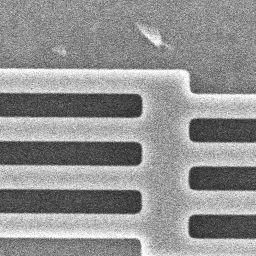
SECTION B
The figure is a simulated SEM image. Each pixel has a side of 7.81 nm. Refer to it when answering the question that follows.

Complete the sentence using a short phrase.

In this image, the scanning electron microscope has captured groups of lines, slits or small figures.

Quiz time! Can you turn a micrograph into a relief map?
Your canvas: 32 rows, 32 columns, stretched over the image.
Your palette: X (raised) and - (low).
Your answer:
--------------------------------
--------------------------------
--------------------------------
--------------------------------
--------------------------------
--------------------------------
--------------------------------
--------------------------------
--------------------------------
XXXXXXXXXXXXXXXXXXXXXXXX--------
XXXXXXXXXXXXXXXXXXXXXXXX--------
XXXXXXXXXXXXXXXXXXXXXXXX--------
------------------XXXXXXXXXXXXXX
------------------XXXXXXXXXXXXXX
-----------------XXXXXXXXXXXXXXX
XXXXXXXXXXXXXXXXXXXXXXXX--------
XXXXXXXXXXXXXXXXXXXXXXXX--------
XXXXXXXXXXXXXXXXXXXXXXXX--------
------------------XXXXXXXXXXXXXX
------------------XXXXXXXXXXXXXX
-----------------XXXXXXXXXXXXXXX
XXXXXXXXXXXXXXXXXXXXXXXX--------
XXXXXXXXXXXXXXXXXXXXXXX---------
XXXXXXXXXXXXXXXXXXXXXXXX--------
------------------XXXXXXXXXXXXXX
------------------XXXXXXXXXXXXXX
-----------------XXXXXXXXXXXXXXX
XXXXXXXXXXXXXXXXXXXXXXXX--------
XXXXXXXXXXXXXXXXXXXXXXX---------
XXXXXXXXXXXXXXXXXXXXXXXX--------
------------------XXXXXXXXXXXXXX
------------------XXXXXXXXXXXXXX